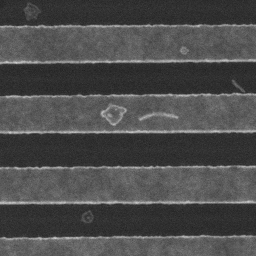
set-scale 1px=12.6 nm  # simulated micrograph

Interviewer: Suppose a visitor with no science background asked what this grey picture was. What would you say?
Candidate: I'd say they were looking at lines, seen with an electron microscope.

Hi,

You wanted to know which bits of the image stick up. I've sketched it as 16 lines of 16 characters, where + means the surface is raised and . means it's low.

................
................
++++++++++++++++
++++++++++++++++
................
................
++++++++++++++++
++++++++++++++++
................
................
++++++++++++++++
++++++++++++++++
++++++++++++++++
................
................
++++++++++++++++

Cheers